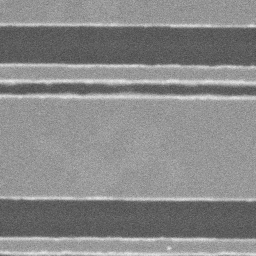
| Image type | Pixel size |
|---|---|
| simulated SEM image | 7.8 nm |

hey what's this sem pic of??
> lines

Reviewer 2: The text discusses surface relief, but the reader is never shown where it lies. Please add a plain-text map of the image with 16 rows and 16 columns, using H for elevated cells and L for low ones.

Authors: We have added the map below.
HHHHHHHHHHHHHHHH
HHHHHHHHHHHHHHHH
LLLLLLLLLLLLLLLL
LLLLLLLLLLLLLLLL
HHHHHHHHHHHHHHHH
HHHHHHHHHHHHHHHH
HHHHHHHHHHHHHHHH
HHHHHHHHHHHHHHHH
HHHHHHHHHHHHHHHH
HHHHHHHHHHHHHHHH
HHHHHHHHHHHHHHHH
HHHHHHHHHHHHHHHH
LLLLLLLLLLLLLLLL
LLLLLLLLLLLLLLLL
LLLLLLLLLLLLLLLL
HHHHHHHHHHHHHHHH